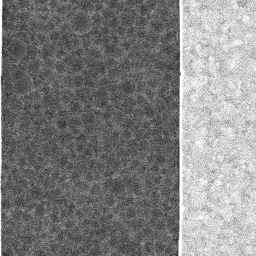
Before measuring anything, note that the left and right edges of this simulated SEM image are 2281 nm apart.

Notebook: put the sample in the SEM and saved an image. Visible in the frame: one or a few lines or trenches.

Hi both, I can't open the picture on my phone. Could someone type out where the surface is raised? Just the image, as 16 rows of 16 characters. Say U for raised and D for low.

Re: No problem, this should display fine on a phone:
DDDDDDDDDDDUUUUU
DDDDDDDDDDDUUUUU
DDDDDDDDDDDUUUUU
DDDDDDDDDDDUUUUU
DDDDDDDDDDDUUUUU
DDDDDDDDDDDUUUUU
DDDDDDDDDDDUUUUU
DDDDDDDDDDDUUUUU
DDDDDDDDDDDUUUUU
DDDDDDDDDDDUUUUU
DDDDDDDDDDDUUUUU
DDDDDDDDDDDUUUUU
DDDDDDDDDDDUUUUU
DDDDDDDDDDDUUUUU
DDDDDDDDDDDUUUUU
DDDDDDDDDDDUUUUU